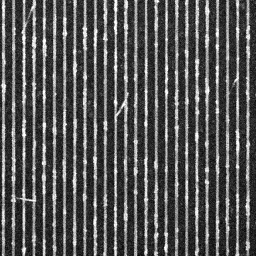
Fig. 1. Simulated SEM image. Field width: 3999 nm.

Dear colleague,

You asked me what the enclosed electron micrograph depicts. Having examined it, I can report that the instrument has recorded parallel lines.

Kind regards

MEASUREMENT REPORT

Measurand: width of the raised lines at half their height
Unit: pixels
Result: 2.38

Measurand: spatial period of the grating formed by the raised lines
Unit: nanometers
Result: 159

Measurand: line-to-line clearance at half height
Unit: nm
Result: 127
